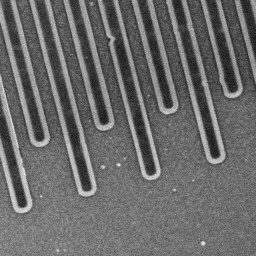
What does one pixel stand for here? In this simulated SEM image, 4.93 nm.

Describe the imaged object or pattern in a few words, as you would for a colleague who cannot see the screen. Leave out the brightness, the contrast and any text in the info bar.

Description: parallel lines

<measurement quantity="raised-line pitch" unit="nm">164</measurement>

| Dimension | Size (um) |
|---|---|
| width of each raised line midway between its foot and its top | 0.0789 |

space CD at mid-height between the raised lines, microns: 0.0872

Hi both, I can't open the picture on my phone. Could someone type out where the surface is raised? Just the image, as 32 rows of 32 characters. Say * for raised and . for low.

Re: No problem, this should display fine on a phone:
**..**..**...**..**..**..**...**
**..**...**..**..**..**...**..**
**...**..**..**..**...**..**..**
***..**..**..**...**..**..**..**
.**..**..**...**..**..**..***..*
.**..**...**..**..**..**...**..*
.**..***..**..**..**...**..**..*
.***..**..**..**...**..**..**..*
..**..**..**...**..**..**..***..
..**..**...**..**..**..**...**..
..**...**..**..**..**...**..**..
..***..**..**..**...**..**..**..
*..**..**..**...**..**..**......
*..**..**...**..**..**..**......
*..**...**..**..**.......**.....
*..***..**..**..**.......**.....
**..**..**.......**......**.....
**..**..**.......**......***....
**.......**......**.......**....
**.......**......**.......**....
.**......**.......**............
.**......**.......**............
.**.......**....................
.**.......**....................
..**............................
..**............................
................................
................................
................................
................................
................................
................................